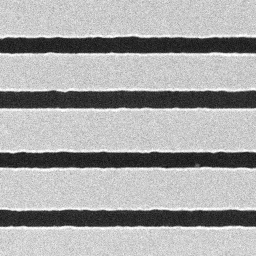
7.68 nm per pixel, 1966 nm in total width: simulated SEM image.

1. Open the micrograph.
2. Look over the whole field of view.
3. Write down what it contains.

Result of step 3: lines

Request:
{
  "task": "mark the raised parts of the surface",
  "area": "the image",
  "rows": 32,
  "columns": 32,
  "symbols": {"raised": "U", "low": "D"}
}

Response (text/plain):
UUUUUUUUUUUUUUUUUUUUUUUUUUUUUUUU
UUUUUUUUUUUUUUUUUUUUUUUUUUUUUUUU
UUUUUUUUUUUUUUUUUUUUUUUUUUUUUUUU
UUUUUUUUUUUUUUUUUUUUUUUUUUUUUUUU
UUUUUUUUUUUUUUUUUUUUUUUUUUUUUUUU
DDDDDDDDDDDDDDDDDDDDDDDDDDDDDDDD
DDDDDDDDDDDDDDDDDDDDDDDDDDDDDDDD
UUUUUUUUUUUUUUUUUUUUUUUUUUUUUUUU
UUUUUUUUUUUUUUUUUUUUUUUUUUUUUUUU
UUUUUUUUUUUUUUUUUUUUUUUUUUUUUUUU
UUUUUUUUUUUUUUUUUUUUUUUUUUUUUUUU
DDDDDDDDDDDDDDDDDDDDDDDDDDDDDDDD
DDDDDDDDDDDDDDDDDDDDDDDDDDDDDDDD
DDDDDDDDDDDDDDDDDDDDDDDDDDDDDDDD
UUUUUUUUUUUUUUUUUUUUUUUUUUUUUUUU
UUUUUUUUUUUUUUUUUUUUUUUUUUUUUUUU
UUUUUUUUUUUUUUUUUUUUUUUUUUUUUUUU
UUUUUUUUUUUUUUUUUUUUUUUUUUUUUUUU
UUUUUUUUUUUUUUUUUUUUUUUUUUUUUUUU
DDDDDDDDDDDDDDDDDDDDDDDDDDDDDDDD
DDDDDDDDDDDDDDDDDDDDDDDDDDDDDDDD
UUUUUUUUUUUUUUUUUUUUUUUUUUUUUUUU
UUUUUUUUUUUUUUUUUUUUUUUUUUUUUUUU
UUUUUUUUUUUUUUUUUUUUUUUUUUUUUUUU
UUUUUUUUUUUUUUUUUUUUUUUUUUUUUUUU
UUUUUUUUUUUUUUUUUUUUUUUUUUUUUUUU
DDDDDDDDDDDDDDDDDDDDDDDDDDDDDDDD
DDDDDDDDDDDDDDDDDDDDDDDDDDDDDDDD
UUUUUUUUUUUUUUUUUUUUUUUUUUUUUUUU
UUUUUUUUUUUUUUUUUUUUUUUUUUUUUUUU
UUUUUUUUUUUUUUUUUUUUUUUUUUUUUUUU
UUUUUUUUUUUUUUUUUUUUUUUUUUUUUUUU